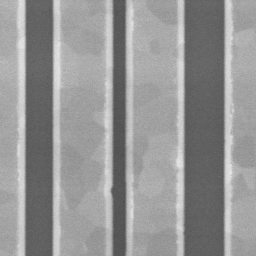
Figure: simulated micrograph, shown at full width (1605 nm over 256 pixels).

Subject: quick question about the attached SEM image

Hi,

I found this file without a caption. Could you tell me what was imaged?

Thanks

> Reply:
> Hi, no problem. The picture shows one or a few lines or trenches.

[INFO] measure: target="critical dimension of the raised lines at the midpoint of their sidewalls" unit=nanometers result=328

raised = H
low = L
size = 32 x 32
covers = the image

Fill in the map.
HHHLLLLHHHHHHHLLHHHHHHHLLLLLLHHH
HHHLLLLHHHHHHHLLHHHHHHHLLLLLLHHH
HHHLLLLHHHHHHHLLHHHHHHHLLLLLLHHH
HHHLLLLHHHHHHHLLHHHHHHHLLLLLLHHH
HHHLLLLHHHHHHHLLHHHHHHHLLLLLLHHH
HHHLLLLHHHHHHHLLHHHHHHHLLLLLLHHH
HHHLLLLHHHHHHHLLHHHHHHHLLLLLLHHH
HHHLLLLHHHHHHHLLHHHHHHHLLLLLLHHH
HHHLLLLHHHHHHHLLHHHHHHHLLLLLLHHH
HHHLLLLHHHHHHHLLHHHHHHHLLLLLLHHH
HHHLLLLHHHHHHHLLHHHHHHHLLLLLLHHH
HHHLLLLHHHHHHHLLHHHHHHHLLLLLLHHH
HHHLLLLHHHHHHHLLHHHHHHHLLLLLLHHH
HHHLLLLHHHHHHHLLHHHHHHHLLLLLLHHH
HHHLLLLHHHHHHHLLHHHHHHHLLLLLLHHH
HHHLLLLHHHHHHHLLHHHHHHHLLLLLLHHH
HHHLLLLHHHHHHHLLHHHHHHHLLLLLLHHH
HHHLLLLHHHHHHHLLHHHHHHHLLLLLLHHH
HHHLLLLHHHHHHHLLHHHHHHHLLLLLLHHH
HHHLLLLHHHHHHHLLHHHHHHHLLLLLLHHH
HHHLLLLHHHHHHHLLHHHHHHHLLLLLLHHH
HHHLLLLHHHHHHHLLHHHHHHHLLLLLLHHH
HHHLLLLHHHHHHHLLHHHHHHHLLLLLLHHH
HHHLLLLHHHHHHLLLHHHHHHHLLLLLLHHH
HHHLLLLHHHHHHHLLHHHHHHHLLLLLLHHH
HHHLLLLHHHHHHHLLHHHHHHHLLLLLLHHH
HHHLLLLHHHHHHHLLHHHHHHHLLLLLLHHH
HHHLLLLHHHHHHHLLHHHHHHHLLLLLLHHH
HHHLLLLHHHHHHHLLHHHHHHHLLLLLLHHH
HHHLLLLHHHHHHHLLHHHHHHHLLLLLLHHH
HHHLLLLHHHHHHHLLHHHHHHHLLLLLLHHH
HHHLLLLHHHHHHHLLHHHHHHHLLLLLLHHH